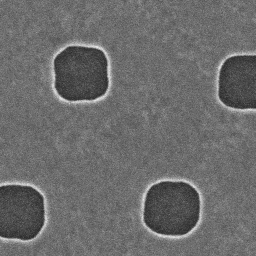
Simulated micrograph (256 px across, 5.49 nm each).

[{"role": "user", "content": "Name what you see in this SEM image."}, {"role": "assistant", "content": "holes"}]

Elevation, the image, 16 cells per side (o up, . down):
oooooooooooooooo
oooooooooooooooo
oooooooooooooooo
oooo...oooooooo.
ooo....ooooooo..
ooo....ooooooo..
oooooooooooooo..
oooooooooooooooo
oooooooooooooooo
oooooooooooooooo
oooooooooooooooo
oooooooooo..oooo
...oooooo....ooo
...oooooo...oooo
..oooooooo..oooo
oooooooooooooooo